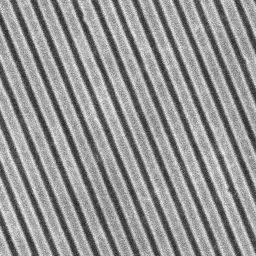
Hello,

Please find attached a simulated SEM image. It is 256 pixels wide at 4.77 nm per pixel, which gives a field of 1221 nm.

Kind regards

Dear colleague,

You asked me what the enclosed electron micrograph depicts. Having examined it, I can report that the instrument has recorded parallel lines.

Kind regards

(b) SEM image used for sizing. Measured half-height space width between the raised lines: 38.1 nanometers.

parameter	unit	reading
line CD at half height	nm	52.5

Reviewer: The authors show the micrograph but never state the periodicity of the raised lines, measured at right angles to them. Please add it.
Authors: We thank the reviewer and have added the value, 89.9 nanometres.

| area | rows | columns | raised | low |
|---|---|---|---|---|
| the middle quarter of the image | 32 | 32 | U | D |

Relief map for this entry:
UUUDDUUUDDUUUDDUUUDDDUUDDUUUDDDU
UUUDDDUUUDDUUUDDUUUDDUUUDDUUUDDU
DUUUDDUUUDDUUUDDUUUDDUUUDDDUUDDU
DUUUDDUUUDDDUUDDDUUUDDUUDDDUUUDD
DDUUUDDUUUDDUUUDDUUUDDUUUDDUUUDD
DDUUUDDUUUDDUUUDDUUUDDDUUDDDUUDD
DDUUUDDDUUUDDUUUDDUUUDDUUUDDUUUD
UDDUUUDDUUUDDUUUDDUUUDDUUUDDDUUD
UDDUUUDDUUUDDDUUDDDUUUDDUUUDDUUU
UUDDUUUDDUUUDDUUUDDUUUDDUUUDDUUU
UUDDUUUDDUUUDDUUUDDDUUDDDUUUDDUU
UUUDDUUDDDUUUDDUUUDDUUUDDUUUDDUU
UUUDDUUUDDUUUDDUUUDDUUUDDUUUDDUU
UUUDDUUUDDUUUDDDUUUDDUUUDDUUUDDU
DUUUDDUUUDDUUUDDUUUDDUUUDDUUUDDU
DUUUDDUUUDDUUUDDUUUDDDUUDDDUUUDD
DDUUDDDUUDDDUUUDDUUUDDUUUDDUUUDD
DDUUUDDUUUDDUUUDDUUUDDUUUDDUUUDD
DDDUUDDUUUDDDUUDDDUUUDDUUUDDUUUD
UDDUUUDDUUUDDUUUDDUUUDDUUUDDUUUD
UDDUUUDDUUUDDUUUDDUUUDDDUUDDDUUU
UDDDUUDDDUUUDDUUUDDUUUDDUUUDDUUU
UUDDUUUDDUUUDDUUUDDUUUDDUUUDDUUU
UUDDUUUDDUUUDDDUUDDDUUUDDUUUDDUU
UUDDDUUUDDUUUDDUUUDDUUUDDUUUDDUU
UUUDDUUUDDUUUDDUUUDDUUUDDDUUUDDU
DUUDDDUUUDDUUUDDUUUDDUUUDDUUUDDU
DUUUDDUUUDDUUUDDUUUDDUUUDDUUUDDU
DUUUDDDUUDDUUUDDDUUUDDUUUDDUUUDD
DDUUUDDUUUDDUUUDDUUUDDUUUDDUUUDD
DDUUUDDUUUDDUUUDDUUUDDDUUDDDUUUD
DDDUUDDDUUDDDUUUDDUUUDDUUUDDUUUD